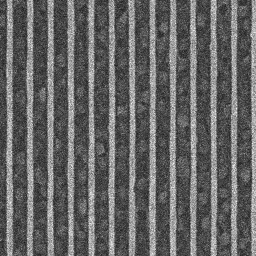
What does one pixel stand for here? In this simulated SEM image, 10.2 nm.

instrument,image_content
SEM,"parallel lines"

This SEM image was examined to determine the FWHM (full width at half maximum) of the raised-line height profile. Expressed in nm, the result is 50.7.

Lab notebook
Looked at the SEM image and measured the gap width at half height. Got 155 nm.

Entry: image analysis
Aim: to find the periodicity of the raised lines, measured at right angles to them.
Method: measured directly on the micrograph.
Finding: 0.207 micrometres